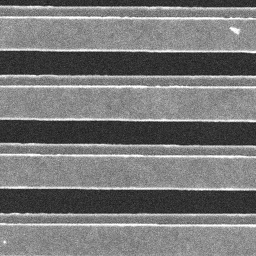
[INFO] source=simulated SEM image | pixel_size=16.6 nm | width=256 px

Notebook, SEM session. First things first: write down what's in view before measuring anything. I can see lines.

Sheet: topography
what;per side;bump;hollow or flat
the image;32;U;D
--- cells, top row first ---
DDDDDDDDDDDDDDDDDDDDDDDDDDDDDDDD
UUUUUUUUUUUUUUUUUUUUUUUUUUUUUUUU
UUUUUUUUUUUUUUUUUUUUUUUUUUUUUUUU
UUUUUUUUUUUUUUUUUUUUUUUUUUUUUUUU
UUUUUUUUUUUUUUUUUUUUUUUUUUUUUUUU
UUUUUUUUUUUUUUUUUUUUUUUUUUUUUUUU
DDDDDDDDDDDDDDDDDDDDDDDDDDDDDDDU
DDDDDDDDDDDDDDDDDDDDDDDDDDDDDDDD
DDDDDDDDDDDDDDDDDDDDDDDDDDDDDDDD
UUUUUUUDDDDDDDDDDDDDDDDDDDDDDDDD
UUUUUUUUUUUUUUUUUUUUUUUUUUUUUUUU
UUUUUUUUUUUUUUUUUUUUUUUUUUUUUUUU
UUUUUUUUUUUUUUUUUUUUUUUUUUUUUUUU
UUUUUUUUUUUUUUUUUUUUUUUUUUUUUUUU
UUUUUUUUUUUUUUUUUUUUUUUUUUUUUUUU
DDDDDDDDDDDDDDDDDDDDDDDDDDDDDDDD
DDDDDDDDDDDDDDDDDDDDDDDDDDDDDDDD
DDDDDDDDDDDDDDDDDDDDDDDDDDDDDDDD
UUUUUUUUUUUUUUUUUUUUUUUUUUUUUUUU
UUUUUUUUUUUUUUUUUUUUUUUUUUUUUUUU
UUUUUUUUUUUUUUUUUUUUUUUUUUUUUUUU
UUUUUUUUUUUUUUUUUUUUUUUUUUUUUUUU
UUUUUUUUUUUUUUUUUUUUUUUUUUUUUUUU
UUUUUUUUUUUUUUUUUUUUUUUUUUUUUUUU
DDDDDDDDDDDDDDDDDDDDDDDDDDDDDDDD
DDDDDDDDDDDDDDDDDDDDDDDDDDDDDDDD
DDDDDDDDDDDDDDDDDDDDDDDDDDDDDDDD
UUUUUUUUUUUUUUUUUUUUUUUUUUUUUUUU
UUUUUUUUUUUUUUUUUUUUUUUUUUUUUUUU
UUUUUUUUUUUUUUUUUUUUUUUUUUUUUUUU
UUUUUUUUUUUUUUUUUUUUUUUUUUUUUUUU
UUUUUUUUUUUUUUUUUUUUUUUUUUUUUUUU